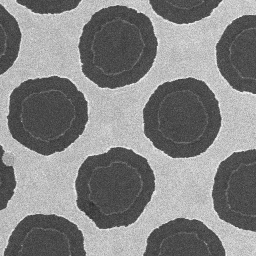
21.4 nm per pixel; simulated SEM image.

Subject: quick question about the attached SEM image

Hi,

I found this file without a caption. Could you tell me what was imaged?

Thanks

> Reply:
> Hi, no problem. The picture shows ring-shaped grooves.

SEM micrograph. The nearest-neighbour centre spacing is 2050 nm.